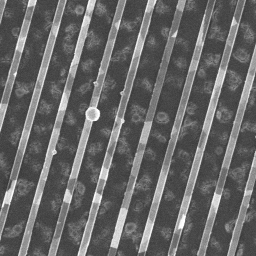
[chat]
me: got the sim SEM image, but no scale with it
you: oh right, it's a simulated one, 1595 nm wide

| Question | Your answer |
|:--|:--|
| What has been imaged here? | parallel lines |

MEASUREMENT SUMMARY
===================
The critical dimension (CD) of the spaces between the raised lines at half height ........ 138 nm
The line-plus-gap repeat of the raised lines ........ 179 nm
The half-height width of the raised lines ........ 42.8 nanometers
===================